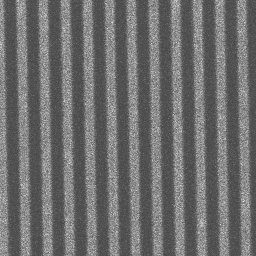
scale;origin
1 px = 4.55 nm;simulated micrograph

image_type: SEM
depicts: parallel lines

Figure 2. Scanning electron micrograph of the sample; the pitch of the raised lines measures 100 nm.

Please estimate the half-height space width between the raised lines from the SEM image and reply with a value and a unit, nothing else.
51.7 nanometres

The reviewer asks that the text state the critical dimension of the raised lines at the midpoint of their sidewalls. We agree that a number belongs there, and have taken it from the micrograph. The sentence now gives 47.2 nanometers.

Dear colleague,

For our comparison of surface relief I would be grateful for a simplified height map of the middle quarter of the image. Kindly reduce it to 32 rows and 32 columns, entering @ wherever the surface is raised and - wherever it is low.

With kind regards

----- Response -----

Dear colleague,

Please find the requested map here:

@@---@@---@@@---@@----@@---@@---
@@---@@---@@@---@@----@@---@@---
@@---@@---@@@---@@----@@---@@---
@@---@@---@@@---@@----@@---@@---
@@---@@----@@---@@----@@---@@---
@@---@@----@@---@@----@@---@@---
@@---@@----@@---@@----@@---@@@--
@@---@@----@@---@@----@@---@@@--
@@---@@@---@@---@@---@@@---@@@--
@@---@@@---@@---@@----@@---@@@--
@@---@@@---@@---@@----@@---@@@--
@@---@@@---@@---@@----@@---@@@--
@@---@@@---@@---@@----@@---@@@--
@@---@@@---@@---@@@---@@---@@@--
@@---@@@---@@---@@@---@@---@@@--
@@---@@@---@@---@@@---@@---@@@--
@@---@@@---@@---@@@---@@---@@@--
@@---@@@---@@---@@@---@@---@@@--
@@---@@@---@@---@@@---@@---@@@--
@@---@@@---@@---@@@---@@---@@@--
@@---@@@---@@---@@@---@@---@@@--
@@---@@@---@@---@@@---@@---@@@--
@@---@@@---@@---@@@---@@---@@@--
@@---@@@---@@---@@@---@@---@@@--
@@---@@@---@@---@@@---@@---@@@--
@@---@@@---@@---@@@---@@---@@@--
@@---@@@---@@---@@@---@@----@@--
@@---@@@---@@---@@@---@@----@@--
@@---@@@---@@---@@@---@@----@@--
@@----@@---@@---@@@---@@----@@--
@@----@@---@@---@@@---@@----@@--
@@----@@---@@---@@@---@@----@@--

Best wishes